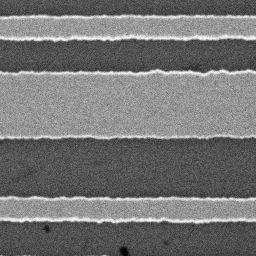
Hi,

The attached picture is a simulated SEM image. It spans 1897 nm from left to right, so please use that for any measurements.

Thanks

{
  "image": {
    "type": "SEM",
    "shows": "lines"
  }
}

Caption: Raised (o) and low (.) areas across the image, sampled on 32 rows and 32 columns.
................................
................................
oooooooooooooooooooooooooooooooo
oooooooooooooooooooooooooooooooo
oooooooooooooooooooooooooooooooo
................................
................................
................................
................................
oooooooooooooooooooooooooooooooo
oooooooooooooooooooooooooooooooo
oooooooooooooooooooooooooooooooo
oooooooooooooooooooooooooooooooo
oooooooooooooooooooooooooooooooo
oooooooooooooooooooooooooooooooo
oooooooooooooooooooooooooooooooo
oooooooooooooooooooooooooooooooo
................................
................................
................................
................................
................................
................................
................................
................................
oooooooooooooooooooooooooooooooo
oooooooooooooooooooooooooooooooo
oooooooooooooooooooooooooooooooo
................................
................................
................................
................................